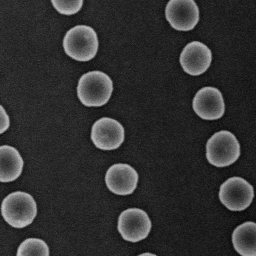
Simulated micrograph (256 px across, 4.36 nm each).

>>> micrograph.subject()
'a regular array of raised bodies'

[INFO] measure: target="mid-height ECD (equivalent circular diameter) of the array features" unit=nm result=144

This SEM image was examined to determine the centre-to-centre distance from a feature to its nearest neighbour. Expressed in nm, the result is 206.